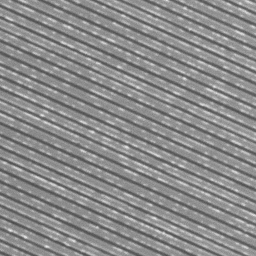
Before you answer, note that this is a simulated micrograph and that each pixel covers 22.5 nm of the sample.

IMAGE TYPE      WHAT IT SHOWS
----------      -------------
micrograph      parallel lines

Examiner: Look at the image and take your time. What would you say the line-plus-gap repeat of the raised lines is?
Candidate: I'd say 242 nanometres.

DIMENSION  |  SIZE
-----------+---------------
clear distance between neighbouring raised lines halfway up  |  89.9 nm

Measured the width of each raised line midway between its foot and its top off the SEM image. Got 6.96 pixels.